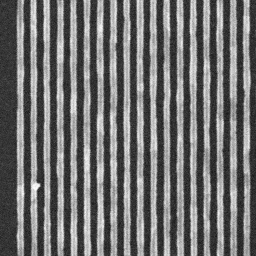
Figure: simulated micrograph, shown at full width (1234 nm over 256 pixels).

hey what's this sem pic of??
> parallel lines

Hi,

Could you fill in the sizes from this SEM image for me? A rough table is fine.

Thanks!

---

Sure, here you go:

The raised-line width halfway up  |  24.7 nm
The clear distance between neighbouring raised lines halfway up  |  0.041 um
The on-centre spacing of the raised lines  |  0.0643 µm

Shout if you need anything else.